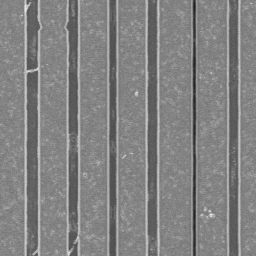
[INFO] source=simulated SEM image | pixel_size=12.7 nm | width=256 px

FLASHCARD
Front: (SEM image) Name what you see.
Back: parallel lines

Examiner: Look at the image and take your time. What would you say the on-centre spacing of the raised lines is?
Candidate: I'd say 39.7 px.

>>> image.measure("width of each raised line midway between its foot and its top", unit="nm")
381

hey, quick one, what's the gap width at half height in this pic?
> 140 nm